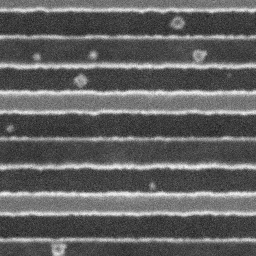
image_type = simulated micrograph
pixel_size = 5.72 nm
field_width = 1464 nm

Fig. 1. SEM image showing lines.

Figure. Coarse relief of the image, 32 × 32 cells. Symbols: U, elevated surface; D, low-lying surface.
UUUUUUUUUUUUUUUUUUUUUUUUUUUUUUUU
DDDDDDDDDDDDDDDDDDDDDDDDDDDDDDDD
DDDDDDDDDDDDDDDDDDDDDDDDDDDDDDDD
DDDDDDDDDDDDDDDDDDDDDDDDDDDDDDDD
DDDDDDDDDDDDDDDDDDDDDDDDDDDDDDDD
UUUUUUUUUUUUUUUUUUUUUUUUUUUUUUUU
UUUUUUUUUUUUUUUUUUUUUUUUUUUUUUUU
UUUUUUUUUUUUUUUUUUUUUUUUUUUUUUUU
DDDDDDDDDDDDDDDDDDDDDDDDDDDDDDDD
DDDDDDDDDDDDDDDDDDDDDDDDDDDDDDDD
DDDDDDDDDDDDDDDDDDDDDDDDDDDDDDDD
UUUUUUUDUUUUDDUDUUUUUDUUUUDDUUUU
UUUUUUUUUUUUUUUUUUUUUUUUUUUUUUUU
UUUUUUUUUUUUUUUUUUUUUUUUUUUUUUUU
DDDDDDDDDDDDDDDDDDDDDDDDDDDDDDDD
DDDDDDDDDDDDDDDDDDDDDDDDDDDDDDDD
DDDDDDDDDDDDDDDDDDDDDDDDDDDDDDDD
UUUUUUUUUUUUUUUUUUUUUUUUUUUUUUUU
UUUUUUUUUUUUUUUUUUUUUUUUUUUUUUUU
UUUUUUUUUUUUUUUUUUUUUUUUUUUUUUUU
UUUUUUUUUUUUUUUUUUUUUUUUUUUUUUUU
DDDDDDDDDDDDDDDDDDDDDDDDDDDDDDDD
DDDDDDDDDDDDDDDDDDDDDDDDDDDDDDDD
DDDDDDDDDDDDDDDDDDDDDDDDDDDDDDDD
UUUUUUUUUUUUUUUUUUUUUUUUUUUUUUUU
UUUUUUUUUUUUUUUUUUUUUUUUUUUUUUUU
UUUUUUUUUUUUUUUUUUUUUUUUUUUUUUUU
DDDDDDDDDDDDDDDDDDDDDDDDDDDDDDDD
DDDDDDDDDDDDDDDDDDDDDDDDDDDDDDDD
DDDDDDDDDDDDDDDDDDDDDDDDDDDDDDDD
UUUUUUUUUUUUUUUUUUUUUUUUUUUUUUUU
UUUUUUUUUUUUUUUUUUUUUUUUUUUUUUUU